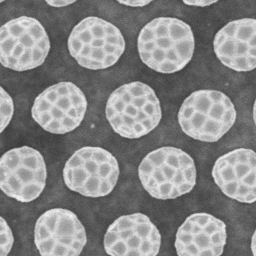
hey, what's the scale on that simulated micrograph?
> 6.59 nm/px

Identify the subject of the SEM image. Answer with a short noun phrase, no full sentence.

raised bodies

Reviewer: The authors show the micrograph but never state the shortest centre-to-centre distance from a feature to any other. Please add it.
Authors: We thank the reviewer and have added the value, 463 nm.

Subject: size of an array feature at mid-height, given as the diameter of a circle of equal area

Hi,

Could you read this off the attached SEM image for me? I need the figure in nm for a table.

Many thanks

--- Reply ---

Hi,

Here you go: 350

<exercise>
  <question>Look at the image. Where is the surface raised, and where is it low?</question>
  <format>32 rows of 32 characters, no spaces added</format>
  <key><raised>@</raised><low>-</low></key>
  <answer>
------@@@-------@@------@@------
--------------------------------
--@@-------@@------@@@--------@@
@@@@@----@@@@@----@@@@@@----@@@@
@@@@@@---@@@@@@--@@@@@@@---@@@@@
@@@@@@---@@@@@@@-@@@@@@@---@@@@@
@@@@@@---@@@@@@--@@@@@@@---@@@@@
@@@@@-----@@@@@---@@@@@@----@@@@
-@@@-------@@------@@@@------@@@
--------------------------------
-------@@-------@@--------------
@----@@@@@----@@@@@-------@@----
@----@@@@@@--@@@@@@@---@@@@@@---
@---@@@@@@@--@@@@@@@---@@@@@@---
@---@@@@@@---@@@@@@@--@@@@@@@---
@----@@@@@----@@@@@@---@@@@@@---
------@@-------@@@@----@@@@@----
-------------------------@@-----
--@@----------------@@----------
@@@@@----@@@@@----@@@@@@----@@@@
@@@@@@--@@@@@@@---@@@@@@---@@@@@
@@@@@@--@@@@@@@--@@-@@-@---@@@@@
@@@@@@--@@@@@@@---@@@@@@---@@@@@
@@@@@----@@@@@----@@@@@@----@@@@
-@@@@------@-------@@@-------@@@
--------------------------------
------@@@-----------------------
-----@@@@@-----@@@@----@@@@-----
@---@@@@@@-----@@@@@---@@@@@----
@---@@@@@@@--@@@@@@@--@@@@@@----
@----@@@@@@--@@@@@@@--@@@@@@----
@----@@@@@----@@@@@@--@@@@@@----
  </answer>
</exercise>